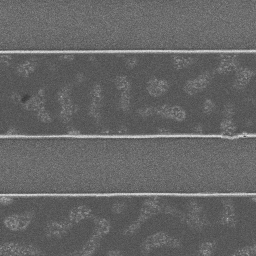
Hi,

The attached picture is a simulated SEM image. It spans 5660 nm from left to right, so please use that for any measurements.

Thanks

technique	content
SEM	one or a few lines or trenches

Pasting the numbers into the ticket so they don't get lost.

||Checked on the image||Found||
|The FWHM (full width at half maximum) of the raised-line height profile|1870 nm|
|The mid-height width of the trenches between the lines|1.3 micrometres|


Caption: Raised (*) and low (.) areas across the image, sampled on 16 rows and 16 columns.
................
................
................
****************
****************
****************
****************
****************
*******......**.
................
................
................
****************
****************
****************
****************